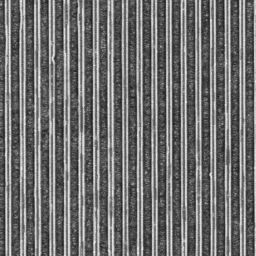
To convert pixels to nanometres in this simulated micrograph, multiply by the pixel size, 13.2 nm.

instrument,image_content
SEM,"parallel lines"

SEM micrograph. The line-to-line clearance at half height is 137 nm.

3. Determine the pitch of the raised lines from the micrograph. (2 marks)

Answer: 0.194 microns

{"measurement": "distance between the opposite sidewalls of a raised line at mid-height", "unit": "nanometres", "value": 57.9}